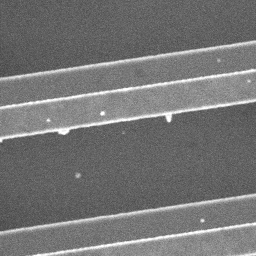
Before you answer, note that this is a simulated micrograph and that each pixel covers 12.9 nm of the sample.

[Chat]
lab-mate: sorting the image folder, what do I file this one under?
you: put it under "lines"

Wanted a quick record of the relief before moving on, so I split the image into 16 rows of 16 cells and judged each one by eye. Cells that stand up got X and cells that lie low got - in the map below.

----------------
----------------
----------------
----------XXXXXX
---XXXXXXXXXXXXX
XXXXXXXXXXXXXXXX
XXXXXXXXXXXXXXX-
XXXXXXXX--------
X---------------
----------------
----------------
----------------
--------------XX
-------XXXXXXXXX
XXXXXXXXXXXXXXXX
XXXXXXXXXXXXXXXX